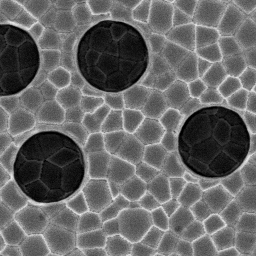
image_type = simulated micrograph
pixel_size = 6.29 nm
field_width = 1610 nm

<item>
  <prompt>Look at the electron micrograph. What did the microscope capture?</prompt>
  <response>holes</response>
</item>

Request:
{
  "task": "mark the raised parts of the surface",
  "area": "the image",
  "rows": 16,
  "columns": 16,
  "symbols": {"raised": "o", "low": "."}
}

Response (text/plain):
oooooooooooooooo
oooooo..oooooooo
..ooo....ooooooo
..ooo....ooooooo
..ooo....ooooooo
..oooo..oooooooo
oooooooooooooooo
oooooooooooo...o
oo..ooooooo.....
o....oooooo.....
o....ooooooo...o
o....ooooooooooo
oo..oooooooooooo
oooooooooooooooo
oooooooooooooooo
oooooooooooooooo